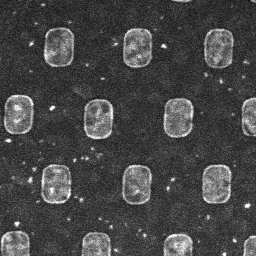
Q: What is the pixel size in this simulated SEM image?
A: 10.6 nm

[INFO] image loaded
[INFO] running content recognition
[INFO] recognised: a regular array of raised bodies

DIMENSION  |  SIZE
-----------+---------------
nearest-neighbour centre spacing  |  820 nanometers